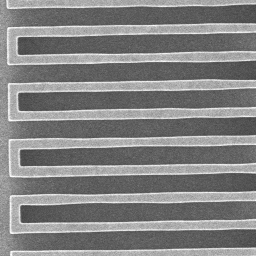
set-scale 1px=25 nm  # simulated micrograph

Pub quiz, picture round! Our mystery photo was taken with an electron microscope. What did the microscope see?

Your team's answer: groups of lines, slits or small figures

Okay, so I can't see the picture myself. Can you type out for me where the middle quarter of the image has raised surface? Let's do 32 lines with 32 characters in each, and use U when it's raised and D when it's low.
DDDDDDDDDDDDDDDDDDDDDDDDDDDDDDDD
DDDDDDDDDDDDDDDDDDDDDDDDDDDDDDDD
DDDDDDDDDDDDDDDDDDDDDDDDDDDDDDDD
DDDDDDDDDDDDDDDDDDDDDDDDDDDDDDDD
DDDDDDDDDDDDDDUUUUUUUUUUUUUUUUUU
UUUUUUUUUUUUUUUUUUUUUUUUUUUUUUUU
UUUUUUUUUUUUUUUUUUUUUUUUUUUUUUUU
DDDDDDDDDDDDDDDDDDDDDDDDDDDDDDDD
DDDDDDDDDDDDDDDDDDDDDDDDDDDDDDDD
DDDDDDDDDDDDDDDDDDDDDDDDDDDDDDDD
DDDDDDDDDDDDDDDDDDDDDDDDDDDDDDDD
DDDDDDDDDDUUUUUUUUUUUUUUUUUUUUUU
UUUUUUUUUUUUUUUUUUUUUUUUUUUUUUUU
UUUUUUUUUUUUUUUUUUUUUUUUUUUUUUDD
DDDDDDDDDDDDDDDDDDDDDDDDDDDDDDDD
DDDDDDDDDDDDDDDDDDDDDDDDDDDDDDDD
DDDDDDDDDDDDDDDDDDDDDDDDDDDDDDDD
DDDDDDDDDDDDDDDDDDDDDDDDDDDDDDDD
DDDDDDDDDDDDDDDDDDDDDDUUUUUUUUUU
UUUUUUUUUUUUUUUUUUUUUUUUUUUUUUUU
UUUUUUUUUUUUUUUUUUUUUUUUUUUUUUUU
DDDDDDDDDDDDDDDDDDDDDDDDDDDDDDDD
DDDDDDDDDDDDDDDDDDDDDDDDDDDDDDDD
DDDDDDDDDDDDDDDDDDDDDDDDDDDDDDDD
DDDDDDDDDDDDDDDDDDDDDDDDDDDDDDDD
DDDDDDDDDDDDDDUUUUUUUUUUUUUUUUUU
UUUUUUUUUUUUUUUUUUUUUUUUUUUUUUUU
UUUUUUUUUUUUUUUUUUUUUUUUUUUUUUUU
DDDDDDDDDDDDDDDDDDDDDDDDDDDDDDDD
DDDDDDDDDDDDDDDDDDDDDDDDDDDDDDDD
DDDDDDDDDDDDDDDDDDDDDDDDDDDDDDDD
DDDDDDDDDDDDDDDDDDDDDDDDDDDDDDDD